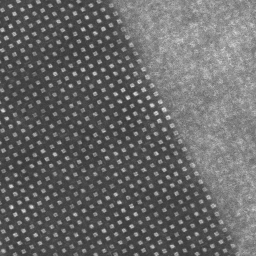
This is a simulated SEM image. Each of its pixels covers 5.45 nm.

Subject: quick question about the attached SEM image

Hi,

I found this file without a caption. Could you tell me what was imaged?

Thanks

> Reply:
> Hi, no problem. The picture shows a regular array of raised bodies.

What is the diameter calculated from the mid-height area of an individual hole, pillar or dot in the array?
22.2 nanometres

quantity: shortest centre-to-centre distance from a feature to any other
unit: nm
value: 46.4